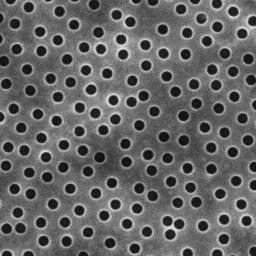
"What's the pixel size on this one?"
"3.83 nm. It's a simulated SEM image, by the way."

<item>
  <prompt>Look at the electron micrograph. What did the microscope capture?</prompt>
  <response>a regular array of holes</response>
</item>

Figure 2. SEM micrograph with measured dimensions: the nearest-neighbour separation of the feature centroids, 74 nm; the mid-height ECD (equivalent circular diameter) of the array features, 10.9 px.